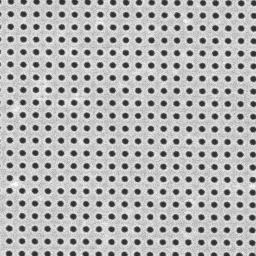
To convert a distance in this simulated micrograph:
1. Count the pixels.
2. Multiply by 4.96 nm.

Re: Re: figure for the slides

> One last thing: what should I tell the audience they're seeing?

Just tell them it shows a regular array of holes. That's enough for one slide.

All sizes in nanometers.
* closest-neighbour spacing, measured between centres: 60.4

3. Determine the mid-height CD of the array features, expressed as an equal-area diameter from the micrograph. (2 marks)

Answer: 30.6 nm